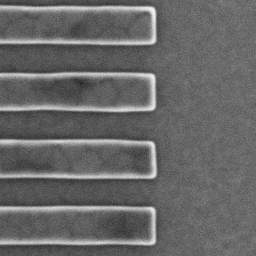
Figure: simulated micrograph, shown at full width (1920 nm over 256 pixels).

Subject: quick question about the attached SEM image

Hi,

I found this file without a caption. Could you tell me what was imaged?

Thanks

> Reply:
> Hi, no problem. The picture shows wiring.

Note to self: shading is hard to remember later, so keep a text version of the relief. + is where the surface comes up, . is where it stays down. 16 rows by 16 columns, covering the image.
+++++++++.......
++++++++++......
+++++++++.......
................
................
++++++++++......
++++++++++......
................
................
++++++++++......
++++++++++......
................
................
++++++++++......
++++++++++......
................